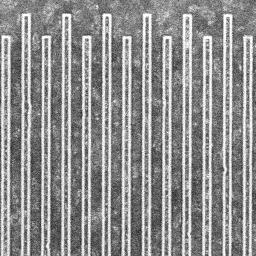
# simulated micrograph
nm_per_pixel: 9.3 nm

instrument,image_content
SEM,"parallel lines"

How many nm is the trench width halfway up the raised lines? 126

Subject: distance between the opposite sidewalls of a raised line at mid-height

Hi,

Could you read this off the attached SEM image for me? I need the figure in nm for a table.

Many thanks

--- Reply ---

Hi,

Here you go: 62.8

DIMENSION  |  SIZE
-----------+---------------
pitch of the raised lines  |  188 nanometers